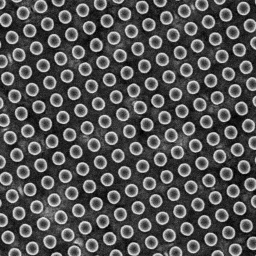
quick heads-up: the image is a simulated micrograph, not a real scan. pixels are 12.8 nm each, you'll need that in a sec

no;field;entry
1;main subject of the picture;a regular array of raised bodies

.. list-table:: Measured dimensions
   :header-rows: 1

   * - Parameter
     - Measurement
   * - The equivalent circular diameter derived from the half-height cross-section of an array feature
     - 12.8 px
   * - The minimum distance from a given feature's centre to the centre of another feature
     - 236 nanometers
